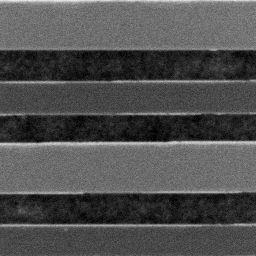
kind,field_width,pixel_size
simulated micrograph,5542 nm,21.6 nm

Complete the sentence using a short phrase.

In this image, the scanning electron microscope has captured lines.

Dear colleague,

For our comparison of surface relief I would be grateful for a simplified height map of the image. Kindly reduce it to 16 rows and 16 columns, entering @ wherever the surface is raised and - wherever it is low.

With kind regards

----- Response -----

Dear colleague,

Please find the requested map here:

@@@@@@@@@@@@@@@@
@@@@@@@@@@@@@@@@
@@@@@@@@@@@@@@@@
----------------
----------------
@@@@@@@@@@@@@@@@
@@@@@@@@@@@@@@@@
----------------
----------------
@@@@@@@@@@@@@@@@
@@@@@@@@@@@@@@@@
@@@@@@@@@@@@@@@@
----------------
----------------
@@@@@@@@@@@@@@@@
@@@@@@@@@@@@@@@@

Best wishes